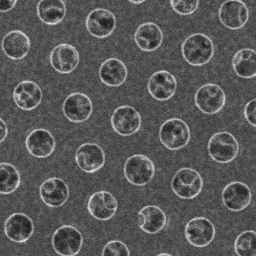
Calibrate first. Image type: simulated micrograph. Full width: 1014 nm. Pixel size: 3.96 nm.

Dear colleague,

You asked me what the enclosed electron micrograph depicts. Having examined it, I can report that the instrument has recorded a regular array of raised bodies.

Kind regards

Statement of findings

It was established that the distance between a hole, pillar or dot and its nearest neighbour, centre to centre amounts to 198 nanometres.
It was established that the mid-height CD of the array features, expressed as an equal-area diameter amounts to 112 nm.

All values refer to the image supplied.